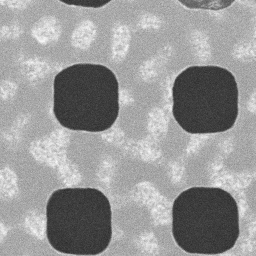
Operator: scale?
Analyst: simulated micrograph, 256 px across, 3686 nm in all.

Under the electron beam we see holes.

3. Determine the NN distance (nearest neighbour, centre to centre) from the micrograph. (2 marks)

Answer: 1730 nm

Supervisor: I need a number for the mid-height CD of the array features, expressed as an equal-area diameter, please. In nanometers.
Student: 1020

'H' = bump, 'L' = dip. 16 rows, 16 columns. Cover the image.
HHHHHHHHHHHHLLHH
HHHHHHHHHHHHHHHH
HHHHHHHHHHHHHHHH
HHHHHHHHHHHHHHHH
HHHHLLLHHHHLLLHH
HHHLLLLHHHHLLLLH
HHHLLLLHHHHLLLLH
HHHHLLLHHHHLLLLH
HHHHHHHHHHHHHHHH
HHHHHHHHHHHHHHHH
HHHHHHHHHHHHHHHH
HHHHHHHHHHHHHHHH
HHHLLLLHHHHLLLLH
HHHLLLLHHHHLLLLH
HHHLLLLHHHHLLLLH
HHHLLLLHHHHLLLHH